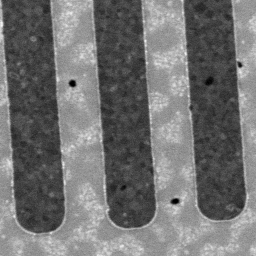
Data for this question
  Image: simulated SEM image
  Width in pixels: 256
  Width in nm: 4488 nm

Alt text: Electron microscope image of one or a few lines or trenches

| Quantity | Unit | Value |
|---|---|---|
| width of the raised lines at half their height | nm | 883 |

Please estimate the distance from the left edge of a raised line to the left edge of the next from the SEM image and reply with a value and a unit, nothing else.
1590 nanometres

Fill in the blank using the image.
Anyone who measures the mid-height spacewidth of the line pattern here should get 40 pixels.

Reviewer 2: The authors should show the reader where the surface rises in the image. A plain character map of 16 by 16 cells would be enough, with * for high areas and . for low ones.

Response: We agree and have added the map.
***...***..****.
***...***..****.
***...***...***.
***...***...***.
****..***...***.
****..***...***.
.***..***...***.
.***..***...***.
.***..***...***.
.***..****..***.
.***...***..***.
.***...***..***.
.***...***..***.
.***...***...**.
..*.............
................